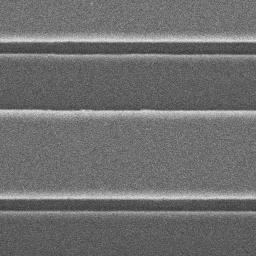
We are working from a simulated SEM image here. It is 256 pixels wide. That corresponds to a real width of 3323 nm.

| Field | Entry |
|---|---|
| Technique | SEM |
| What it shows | lines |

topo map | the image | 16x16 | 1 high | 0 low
1111111111111111
1111111111111111
1111111111111111
0000000000000000
0000000000000000
0000000000000000
0000000000000000
1111111111111111
1111111111111111
1111111111111111
1111111111111111
1111111111111111
0000000000000000
0000000000000000
0000000000000000
0000000000000000